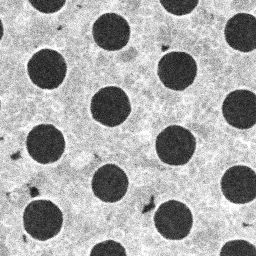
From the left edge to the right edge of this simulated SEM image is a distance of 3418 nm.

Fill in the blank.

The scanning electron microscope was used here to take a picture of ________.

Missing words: a regular array of holes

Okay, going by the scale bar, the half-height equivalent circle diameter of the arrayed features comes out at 0.534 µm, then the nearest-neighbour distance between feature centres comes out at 995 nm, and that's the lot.